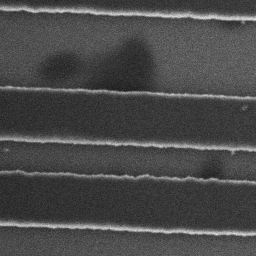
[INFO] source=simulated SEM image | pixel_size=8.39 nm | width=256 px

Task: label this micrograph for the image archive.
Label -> lines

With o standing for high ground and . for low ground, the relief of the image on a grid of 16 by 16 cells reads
oooooooooooooooo
................
................
................
................
oo..............
oooooooooooooooo
oooooooooooooooo
oooooooooooooooo
................
................
oooooooooooooooo
oooooooooooooooo
oooooooooooooooo
...........ooooo
................